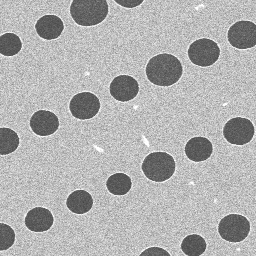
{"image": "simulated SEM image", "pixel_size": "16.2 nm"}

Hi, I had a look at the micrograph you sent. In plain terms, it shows a regular array of holes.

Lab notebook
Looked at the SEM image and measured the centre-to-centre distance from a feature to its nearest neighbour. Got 706 nm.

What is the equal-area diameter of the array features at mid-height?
458 nanometres